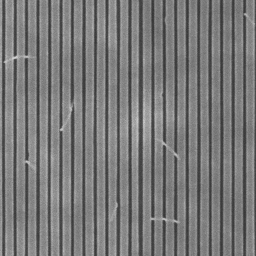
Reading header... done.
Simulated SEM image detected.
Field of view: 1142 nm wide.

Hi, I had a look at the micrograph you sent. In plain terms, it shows parallel lines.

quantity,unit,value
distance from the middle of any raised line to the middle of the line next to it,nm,51.2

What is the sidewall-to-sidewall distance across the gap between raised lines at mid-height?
3.88 pixels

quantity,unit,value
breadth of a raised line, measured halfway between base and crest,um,0.0352